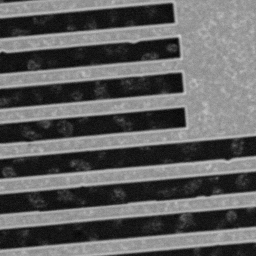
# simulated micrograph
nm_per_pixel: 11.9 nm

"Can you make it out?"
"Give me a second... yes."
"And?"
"parallel lines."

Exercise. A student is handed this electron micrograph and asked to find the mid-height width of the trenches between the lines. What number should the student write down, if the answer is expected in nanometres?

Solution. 266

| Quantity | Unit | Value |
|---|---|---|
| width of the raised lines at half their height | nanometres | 162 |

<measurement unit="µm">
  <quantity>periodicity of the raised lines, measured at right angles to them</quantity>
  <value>0.418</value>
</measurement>